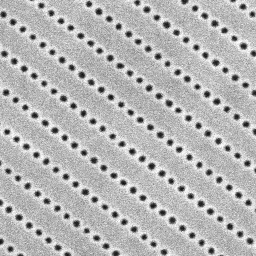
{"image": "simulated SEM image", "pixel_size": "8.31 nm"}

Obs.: a regular array of holes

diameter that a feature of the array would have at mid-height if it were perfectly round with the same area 60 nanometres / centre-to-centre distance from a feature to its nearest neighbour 0.101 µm